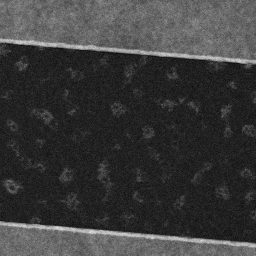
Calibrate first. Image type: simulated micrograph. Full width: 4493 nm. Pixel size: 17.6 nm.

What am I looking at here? one or a few lines or trenches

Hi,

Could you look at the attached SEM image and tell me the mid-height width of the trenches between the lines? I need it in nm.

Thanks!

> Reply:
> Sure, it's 3210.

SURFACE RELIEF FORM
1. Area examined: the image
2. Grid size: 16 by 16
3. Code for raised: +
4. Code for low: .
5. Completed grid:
++++++++++++++++
++++++++++++++++
++++++++++++++++
............++++
................
................
................
................
................
................
................
................
................
................
++++++..........
++++++++++++++++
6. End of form